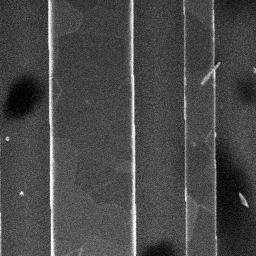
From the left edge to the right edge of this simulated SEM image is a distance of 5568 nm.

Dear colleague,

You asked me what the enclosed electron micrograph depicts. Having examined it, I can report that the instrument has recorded lines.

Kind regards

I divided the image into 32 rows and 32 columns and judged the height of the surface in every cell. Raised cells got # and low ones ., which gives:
......###########......####.....
......###########......####.....
......###########......####.....
......###########......####.....
......###########......####.....
......###########......####.....
......###########......####.....
......###########......####.....
......###########......####.....
......###########......####.....
......###########......####.....
......###########......####.....
......###########......####.....
......###########......####.....
......###########......####.....
......###########......####.....
......###########......####.....
......###########......####.....
......###########......####.....
......###########......####.....
......###########......####.....
......###########......####.....
......###########......####.....
......###########......####.....
......###########......####.....
......###########......####.....
......###########......####.....
......###########......####.....
......###########......####.....
......###########......####.....
......###########......####.....
......###########......####.....